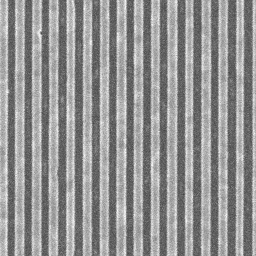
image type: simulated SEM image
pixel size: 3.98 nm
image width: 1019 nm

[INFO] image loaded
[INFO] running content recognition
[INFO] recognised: parallel lines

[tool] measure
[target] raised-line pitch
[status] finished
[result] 67.4 nm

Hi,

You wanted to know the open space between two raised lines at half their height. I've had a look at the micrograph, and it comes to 36.8 nm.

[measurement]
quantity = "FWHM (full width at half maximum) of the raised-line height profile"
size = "33.3 nm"